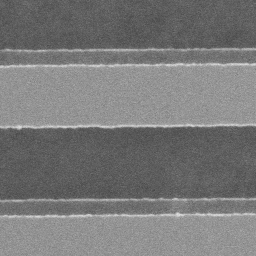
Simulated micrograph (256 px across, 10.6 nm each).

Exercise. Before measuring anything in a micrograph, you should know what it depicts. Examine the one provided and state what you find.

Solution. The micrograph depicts lines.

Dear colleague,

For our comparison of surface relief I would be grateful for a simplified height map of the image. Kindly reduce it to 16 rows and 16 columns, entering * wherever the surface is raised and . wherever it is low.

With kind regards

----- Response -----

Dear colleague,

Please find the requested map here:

................
................
................
****************
****************
****************
****************
****************
................
................
................
................
....*.**********
****************
****************
****************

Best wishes